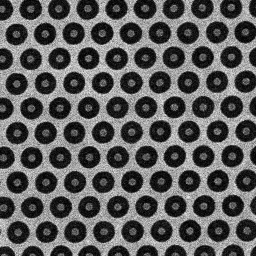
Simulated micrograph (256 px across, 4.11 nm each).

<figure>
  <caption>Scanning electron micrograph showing a regular array of ring-shaped grooves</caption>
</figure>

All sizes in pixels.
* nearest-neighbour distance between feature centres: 28.3